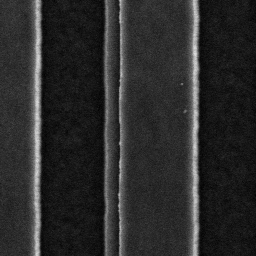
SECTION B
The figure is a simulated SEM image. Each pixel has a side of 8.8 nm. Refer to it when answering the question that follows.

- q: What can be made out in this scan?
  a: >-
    lines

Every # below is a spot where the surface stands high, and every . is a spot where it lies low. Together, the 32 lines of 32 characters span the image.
#####........############.......
#####........############.......
#####........############.......
#####........############.......
#####........############.......
#####........############.......
#####........############.......
#####........############.......
#####........############.......
#####........############.......
#####........############.......
#####........############.......
#####........############.......
#####........############.......
#####........############.......
#####........############.......
#####........############.......
#####........############.......
#####........############.......
#####........############.......
#####........############.......
#####........############.......
#####........############.......
#####........############.......
#####........############.......
#####........############.......
#####........############.......
#####........############.......
#####........############.......
#####........############.......
#####........############.......
#####........############.......